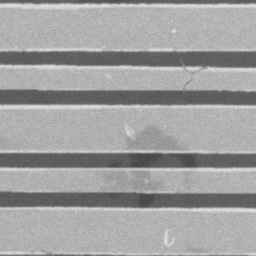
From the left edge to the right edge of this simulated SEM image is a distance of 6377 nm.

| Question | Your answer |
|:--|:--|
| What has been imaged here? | lines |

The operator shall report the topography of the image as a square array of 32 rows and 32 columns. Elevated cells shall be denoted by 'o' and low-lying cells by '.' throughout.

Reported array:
................................
oooooooooooooooooooooooooooooooo
oooooooooooooooooooooooooooooooo
oooooooooooooooooooooooooooooooo
oooooooooooooooooooooooooooooooo
oooooooooooooooooooooooooooooooo
................................
................................
oooooooooooooooooooooooo.o......
oooooooooooooooooooooooooooooooo
oooooooooooooooooooooooooooooooo
................................
................................
oooooooooooooooooooooooooooooooo
oooooooooooooooooooooooooooooooo
oooooooooooooooooooooooooooooooo
oooooooooooooooooooooooooooooooo
oooooooooooooooooooooooooooooooo
oooooooooooooooooooooooooooooooo
................................
................................
oooooooooooooooooooooooooooooooo
oooooooooooooooooooooooooooooooo
oooooooooooooooooooooooooooooooo
................................
................................
oooooooooooooooooooooooooooooooo
oooooooooooooooooooooooooooooooo
oooooooooooooooooooooooooooooooo
oooooooooooooooooooooooooooooooo
oooooooooooooooooooooooooooooooo
oooooooooooooooooooooooooooooooo